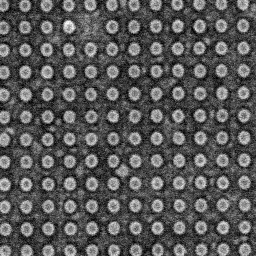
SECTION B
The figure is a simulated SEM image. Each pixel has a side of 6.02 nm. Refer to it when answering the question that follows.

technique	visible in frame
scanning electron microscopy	a regular array of raised bodies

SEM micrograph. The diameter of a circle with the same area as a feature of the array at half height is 70.9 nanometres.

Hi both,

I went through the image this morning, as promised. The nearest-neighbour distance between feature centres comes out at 129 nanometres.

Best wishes